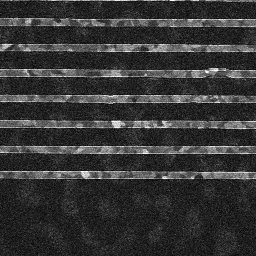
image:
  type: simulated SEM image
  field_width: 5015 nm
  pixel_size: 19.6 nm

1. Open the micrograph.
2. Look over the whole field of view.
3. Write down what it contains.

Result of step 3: parallel lines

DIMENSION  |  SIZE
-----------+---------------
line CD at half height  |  7 pixels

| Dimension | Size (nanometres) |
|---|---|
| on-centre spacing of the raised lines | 498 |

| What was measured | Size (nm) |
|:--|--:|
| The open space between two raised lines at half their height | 360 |